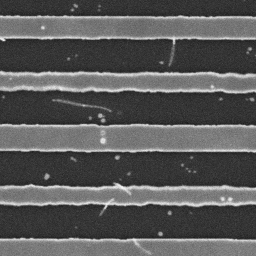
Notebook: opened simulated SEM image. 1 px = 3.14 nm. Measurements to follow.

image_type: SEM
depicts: lines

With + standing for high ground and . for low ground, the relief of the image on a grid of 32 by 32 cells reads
................................
................................
++++++++++++++++++++++++++++++++
++++++++++++++++++++++++++++++++
++++++++++++++++++++++++++++++++
................................
................................
................................
................................
++++++++++++++++++++++++++++++++
++++++++++++++++++++++++++++++++
.............................++.
................................
................................
................................
................................
++++++++++++++++++++++++++++++++
++++++++++++++++++++++++++++++++
++++++++++++++++++++++++++++++++
................................
................................
................................
................................
++++++++++..+++++++...+++++++...
++++++++++++++++++++++++++++++++
....++...+...+++++....++++.+.+..
................................
................................
................................
................................
++++++++++++++++++++++++++++++++
++++++++++++++++++++++++++++++++